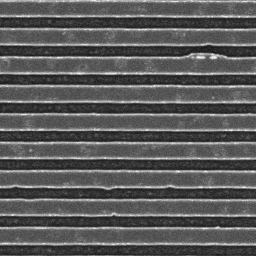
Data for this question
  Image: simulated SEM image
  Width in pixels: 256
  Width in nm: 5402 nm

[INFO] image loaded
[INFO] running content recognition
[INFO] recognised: parallel lines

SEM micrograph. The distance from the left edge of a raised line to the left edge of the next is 600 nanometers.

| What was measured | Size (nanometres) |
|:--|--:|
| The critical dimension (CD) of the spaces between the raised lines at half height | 248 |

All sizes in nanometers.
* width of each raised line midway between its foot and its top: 364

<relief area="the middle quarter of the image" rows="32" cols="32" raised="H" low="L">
HHHHHHHHHHHHHHHHHHHHHHHHHHHHHHHH
HHHHHHHHHHHHHHHHHHHHHHHHHHHHHHHH
LLLLLLLLLLLLLLLLLLLLLLLLLLLLLLLH
LLLLLLLLLLLLLLLLLLLLLLLLLLLLLLLL
LLLLLLLLLLLLLLLLLLLLLLLLLLLLLLLL
HHHHHHHHHHHHHHHHHHHHHHHHHHHHHHHH
HHHHHHHHHHHHHHHHHHHHHHHHHHHHHHHH
HHHHHHHHHHHHHHHHHHHHHHHHHHHHHHHH
HHHHHHHHHHHHHHHHHHHHHHHHHHHHHHHH
LLLLLLLLLLLLLLHHHHHHHHHHHHHHHHHH
LLLLLLLLLLLLLLLLLLLLLLLLLLLLLLLL
LLLLLLLLLLLLLLLLLLLLLLLLLLLLLLLL
HHHHHHHHHHLLLLLLHHHHHHHLHHHHLLLL
HHHHHHHHHHHHHHHHHHHHHHHHHHHHHHHH
HHHHHHHHHHHHHHHHHHHHHHHHHHHHHHHH
HHHHHHHHHHHHHHHHHHHHHHHHHHHHHHHH
HHHHHHHHHHHHHHHHHHHHHHHHHHHHHHHH
LLLLLLLLLLLLLLLLLLLLLLLLLLLLLLLL
LLLLLLLLLLLLLLLLLLLLLLLLLLLLLLLL
LLLLLLLLLLLLLLLLLLLLLLLLLLLLLLLL
HHHHHHHHHHHHHHHHHHHHHHHHHHHHHHHH
HHHHHHHHHHHHHHHHHHHHHHHHHHHHHHHH
HHHHHHHHHHHHHHHHHHHHHHHHHHHHHHHH
HHHHHHHHHHHHHHHHHHHHHHHHHHHHHHHH
LLLLLLLLLLLLLLLLLLLLLLLLLLLLLLLL
LLLLLLLLLLLLLLLLLLLLLLLLLLLLLLLL
LLLLLLLLLLLLLLLLLLLLLLLLLLLLLLLL
HHHHHHHHHHHHHHHHHHHHHHHHHHHHHHHH
HHHHHHHHHHHHHHHHHHHHHHHHHHHHHHHH
HHHHHHHHHHHHHHHHHHHHHHHHHHHHHHHH
HHHHHHHHHHHHHHHHHHHHHHHHHHHHHHHH
LLLLLLLLLLLLLLLLLLLLLLLLLLLLLLLL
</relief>